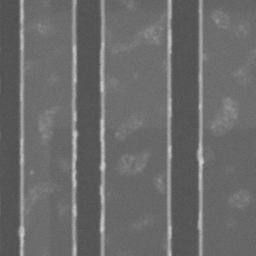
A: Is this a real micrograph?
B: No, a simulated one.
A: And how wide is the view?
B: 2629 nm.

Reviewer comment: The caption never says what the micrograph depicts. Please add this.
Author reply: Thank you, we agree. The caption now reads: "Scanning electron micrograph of one or a few lines or trenches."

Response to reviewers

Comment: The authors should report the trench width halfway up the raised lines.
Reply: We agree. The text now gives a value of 598 nanometers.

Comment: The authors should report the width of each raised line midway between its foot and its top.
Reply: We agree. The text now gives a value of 325 nm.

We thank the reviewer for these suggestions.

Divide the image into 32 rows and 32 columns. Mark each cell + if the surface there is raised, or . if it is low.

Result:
+++......++++........++++.......
+++......++++........++++.......
+++......++++........++++.......
+++......++++........++++.......
+++......++++........++++.......
+++......++++........++++.......
+++......++++........++++.......
+++......++++........++++.......
+++......++++........++++.......
+++......++++........++++.......
+++......++++........++++.......
+++......++++........++++.......
+++......++++........++++.......
+++......++++........++++.......
+++......++++........++++.......
+++......++++........++++.......
+++......++++........++++.......
+++......++++........++++.......
+++......++++........++++.......
+++......++++........++++.......
+++......++++........++++.......
+++......++++........++++.......
+++......++++........++++.......
+++......++++........++++.......
+++......++++........++++.......
+++......++++........++++.......
+++......++++........++++.......
+++......++++........++++.......
+++......++++........++++.......
+++......++++........++++.......
+++......++++........++++.......
+++......++++........++++.......